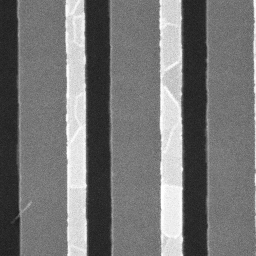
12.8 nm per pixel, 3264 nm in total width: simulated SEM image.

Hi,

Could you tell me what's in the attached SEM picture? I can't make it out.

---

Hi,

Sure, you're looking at lines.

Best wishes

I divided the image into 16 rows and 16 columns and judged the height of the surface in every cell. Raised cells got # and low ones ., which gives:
.####..####..###
.####..####..###
.####..####..###
.####..####..###
.####..####..###
.####..####..###
.####..####..###
.####..####..###
.####..####..###
.####..####..###
.####..####..###
.####..####..###
.####..####..###
.####..####..###
.####..####..###
.####..####..###